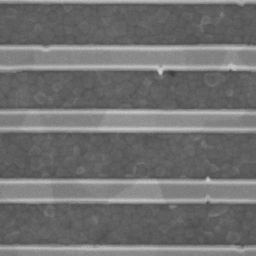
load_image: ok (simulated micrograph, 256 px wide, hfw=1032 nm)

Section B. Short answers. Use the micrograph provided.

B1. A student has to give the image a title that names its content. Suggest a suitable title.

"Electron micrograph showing one or a few lines or trenches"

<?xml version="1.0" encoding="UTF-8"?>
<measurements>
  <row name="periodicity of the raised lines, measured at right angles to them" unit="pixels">66.7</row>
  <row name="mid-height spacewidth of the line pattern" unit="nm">195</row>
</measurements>